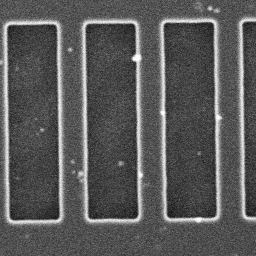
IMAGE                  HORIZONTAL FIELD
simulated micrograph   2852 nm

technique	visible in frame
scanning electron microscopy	groups of lines, slits or small figures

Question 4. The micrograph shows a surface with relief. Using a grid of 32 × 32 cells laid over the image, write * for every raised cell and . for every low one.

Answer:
********************************
********************************
********************************
*......****......***.......***..
*......****......***.......***..
*......****......***.......***..
*......****......***.......***..
*......****......***.......***..
*......****......***.......***..
*......****......***.......***..
*......****......***.......***..
*......****......***.......***..
*......****......***.......***..
*......****......***.......***..
*......****......****......***..
*......****......***.......***..
*......****......***.......***..
*......****......***.......***..
*......****......***.......***..
*.......***......***.......***..
*.......***......****......***..
*.......***......****......***..
*.......***......****......***..
*.......***......****......***..
*.......***......****......***..
*.......***......****......***..
*.......***......****......****.
*......****......***************
********************************
********************************
********************************
********************************